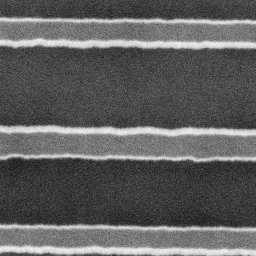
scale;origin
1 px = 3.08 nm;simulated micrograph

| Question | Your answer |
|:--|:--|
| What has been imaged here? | lines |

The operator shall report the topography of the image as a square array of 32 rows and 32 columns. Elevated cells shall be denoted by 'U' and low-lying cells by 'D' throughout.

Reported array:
DDDDDDDDDDDDDDDDDDDDDDDDDDDDDDDD
DDDDDDDDDDDDDDDDDDDDDDDDDDDDDDDD
UDDUDDDUDDDDDDDDDDDDDDDDDDDDDDDD
UUUUUUUUUUUUUUUUUUUUUUUUUUUUUUUU
UUUUUUUUUUUUUUUUUUUUUUUUUUUUUUUU
DDDDDDDDDDDDDDDDDDUUUUUUUUUUUUUU
DDDDDDDDDDDDDDDDDDDDDDDDDDDDDDDD
DDDDDDDDDDDDDDDDDDDDDDDDDDDDDDDD
DDDDDDDDDDDDDDDDDDDDDDDDDDDDDDDD
DDDDDDDDDDDDDDDDDDDDDDDDDDDDDDDD
DDDDDDDDDDDDDDDDDDDDDDDDDDDDDDDD
DDDDDDDDDDDDDDDDDDDDDDDDDDDDDDDD
DDDDDDDDDDDDDDDDDDDDDDDDDDDDDDDD
DDDDDDDDDDDDDDDDDDDDDDDDDDDDDDDD
DDDDDDDDDDDDDDDDDDDDDDDDDDDDDDDD
DDDDDDDDDDDDDDDDDDDDDDDDDDDDDDDD
UUUUUUUUUUUUUUUDUUUUDDDUUUUUUDDD
UUUUUUUUUUUUUUUUUUUUUUUUUUUUUUUU
UUUUUUUUUUUUUUUUUUUUUUUUUUUUUUUU
UDDUUUUDDUUUUUUUUUUUUUUUUUUUUUUU
DDDDDDDDDDDDDDDDDDDDDDDDDDDDDDDD
DDDDDDDDDDDDDDDDDDDDDDDDDDDDDDDD
DDDDDDDDDDDDDDDDDDDDDDDDDDDDDDDD
DDDDDDDDDDDDDDDDDDDDDDDDDDDDDDDD
DDDDDDDDDDDDDDDDDDDDDDDDDDDDDDDD
DDDDDDDDDDDDDDDDDDDDDDDDDDDDDDDD
DDDDDDDDDDDDDDDDDDDDDDDDDDDDDDDD
DDDDDDDDDDDDDDDDDDDDDDDDDDDDDDDD
UUUUUUUUUUUUUUUUUDDDDDDDDDDDDDDD
UUUUUUUUUUUUUUUUUUUUUUUUUUUUUUUU
UUUUUUUUUUUUUUUUUUUUUUUUUUUUUUUU
DDDDDDDDDDDDDDDDDDDDDDDDDUUUDDUU